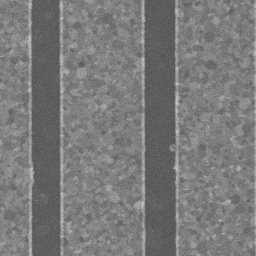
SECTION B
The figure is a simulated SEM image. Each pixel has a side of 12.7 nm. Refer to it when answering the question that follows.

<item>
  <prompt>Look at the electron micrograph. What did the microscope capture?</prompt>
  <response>one or a few lines or trenches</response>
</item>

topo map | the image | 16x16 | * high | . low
**..*****..*****
**..*****..*****
**..*****..*****
**..*****..*****
**..*****..*****
**..*****..*****
**..*****..*****
**..*****..*****
**..*****..*****
**..*****..*****
**..*****..*****
**..*****..*****
**..*****..*****
**..*****..*****
**..*****..*****
**..*****..*****